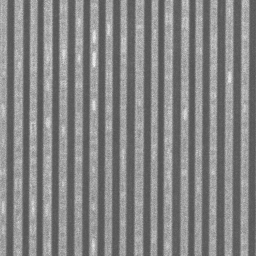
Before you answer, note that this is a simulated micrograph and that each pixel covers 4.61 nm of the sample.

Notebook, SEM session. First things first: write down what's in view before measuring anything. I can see parallel lines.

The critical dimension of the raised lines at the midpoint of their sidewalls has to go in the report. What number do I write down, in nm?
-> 39.2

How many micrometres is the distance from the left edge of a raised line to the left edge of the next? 0.0696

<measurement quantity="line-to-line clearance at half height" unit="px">6.62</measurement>